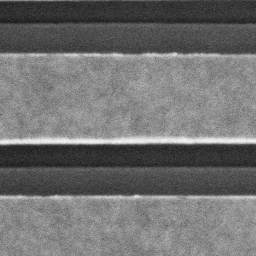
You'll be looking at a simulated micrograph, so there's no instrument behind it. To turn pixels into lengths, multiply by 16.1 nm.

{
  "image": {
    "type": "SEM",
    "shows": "lines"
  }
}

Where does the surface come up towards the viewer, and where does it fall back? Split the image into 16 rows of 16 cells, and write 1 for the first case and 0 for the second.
0000000000000000
0000000000000000
0000000000000000
1111111111111111
1111111111111111
1111111111111111
1111111111111111
1111111111111111
1111111111111111
0000000000000000
0000000000000000
0000000000000000
1111111111111111
1111111111111111
1111111111111111
1111111111111111